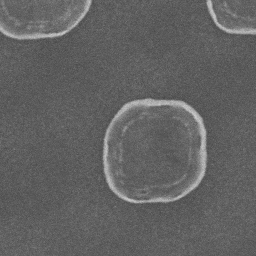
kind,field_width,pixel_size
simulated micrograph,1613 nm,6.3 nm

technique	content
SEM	raised bodies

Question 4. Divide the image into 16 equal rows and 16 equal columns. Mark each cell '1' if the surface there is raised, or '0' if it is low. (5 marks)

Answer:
1111100000000111
1111100000000011
0000000000000000
0000000000000000
0000000000000000
0000000000000000
0000000011100000
0000000111110000
0000000111111000
0000000111111000
0000000111111000
0000000111110000
0000000011100000
0000000000000000
0000000000000000
0000000000000000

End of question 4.